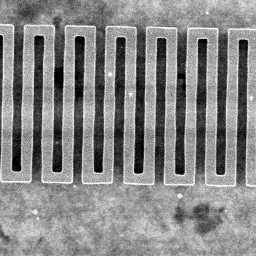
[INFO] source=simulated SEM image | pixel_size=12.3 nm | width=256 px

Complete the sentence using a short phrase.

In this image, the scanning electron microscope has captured groups of lines, slits or small figures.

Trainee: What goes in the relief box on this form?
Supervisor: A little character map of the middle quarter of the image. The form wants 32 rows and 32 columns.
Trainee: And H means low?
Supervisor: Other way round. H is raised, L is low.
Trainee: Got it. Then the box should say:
HHHLLHHHLLHHHLLHHHLLHHHLLLHHLLLH
HHHLLHHHLLHHHLLHHHLLHHHLLLHHLLLH
HHHLLHHHLLHHHLLHHHLLHHHLLLHHLLLH
HHHLLHHHLLHHHLLHHHLLHHHLLLHHLLLH
HHHLLHHHLLHHHLLHHHLLHHHLLLHHLLLH
HHHLLHHHLLHHHLLHHHLLHHHLLLHHLLLH
HHHLLHHHLLHHHLLHHHLLHHHLLHHHLLLH
HHHLLHHHLLHHHLLHHHLLHHHLLHHHLLLH
HHHLLHHHLLHHHLLHHHLLHHHLLHHHLLLH
HHLLLHHHLLHHHLLHHHLLHHHLLHHHLLLH
HHLLLHHHLLHHHLLHHHLLHHHLLHHHLLLH
HHLLLHHHLLHHHLLHHHLLHHHLLHHHLLLH
HHLLLHHHLLHHHLLHHHLLHHHLLHHHLLLH
HHLLLHHHLLHHHLLHHHLLHHHLLHHHLLHH
HHLLLHHLLLHHLLLHHHLLHHHLLHHHLLHH
HHLLLHHLLLHHLLLHHHLLHHHLLHHHLLHH
HHLLLHHLLLHHLLLHHHLLHHHLLHHHLLHH
HHLLLHHLLLHHLLLHHHLLHHHLLHHHLLHH
HHLLLHHLLLHHLLLHHHLLHHHLLHHHLLHH
HHLLLHHLLLHHLLLHHHLLHHHLLHHHLLHH
HHLLLHHLLLHHLLLHHHLLHHHLLHHHLLHH
HHLLLHHLLLHHLLLHHHLLHHLLLHHHLLHH
HHLLLHHLLLHHLLLHHHLLHHLLLHHHLLHH
HHLLLHHLLLHHLLLHHHLLHHLLLHHHLLHH
HHLLLHHLLLHHLLLHHHLLHHLLLHHHLLHH
HHLLLHHLLLHHLLLHHLLLHHLLLHHHLLHH
HHLLLHHLLLHHLLLHHLLLHHLLLHHHLLHH
HHLLLHHHHHHHLLLHHHLHHHLLLHHHLLHH
HHLLLHHHHHHHLLLHHHHHHHLLLHHHHHHH
HHLLLHHHHHHHLLLHHHHHHHLLLHHHHHHH
LLLLLLLLLLLLLLLLLLLLLLLLLLLLLLLL
LLLLLLLLLLLLLLLLLLLLLLLLLLLLLLLL